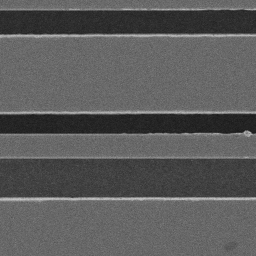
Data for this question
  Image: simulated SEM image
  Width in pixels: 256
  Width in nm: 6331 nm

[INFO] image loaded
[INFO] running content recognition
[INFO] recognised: lines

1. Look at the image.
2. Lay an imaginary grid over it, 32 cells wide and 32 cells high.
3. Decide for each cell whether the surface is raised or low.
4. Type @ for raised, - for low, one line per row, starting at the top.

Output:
@@@@@@@@@@@@@@@@@@@@@@@@@@@@@@@@
--------------------------------
--------------------------------
--------------------------------
@@@@@@@@@@@@@@@@@@@@@@@@@@@@@@@@
@@@@@@@@@@@@@@@@@@@@@@@@@@@@@@@@
@@@@@@@@@@@@@@@@@@@@@@@@@@@@@@@@
@@@@@@@@@@@@@@@@@@@@@@@@@@@@@@@@
@@@@@@@@@@@@@@@@@@@@@@@@@@@@@@@@
@@@@@@@@@@@@@@@@@@@@@@@@@@@@@@@@
@@@@@@@@@@@@@@@@@@@@@@@@@@@@@@@@
@@@@@@@@@@@@@@@@@@@@@@@@@@@@@@@@
@@@@@@@@@@@@@@@@@@@@@@@@@@@@@@@@
@@@@@@@@@@@@@@@@@@@@@@@@@@@@@@@@
--------------------------------
--------------------------------
------------------------------@-
@@@@@@@@@@@@@@@@@@@@@@@@@@@@@@@@
@@@@@@@@@@@@@@@@@@@@@@@@@@@@@@@@
@@@@@@@@@@@@@@@@@@@@@@@@@@@@@@@@
--------------------------------
--------------------------------
--------------------------------
--------------------------------
--------------------------------
@@@@@@@@@@@@@@@@@@@@@@@@@@@@@@@@
@@@@@@@@@@@@@@@@@@@@@@@@@@@@@@@@
@@@@@@@@@@@@@@@@@@@@@@@@@@@@@@@@
@@@@@@@@@@@@@@@@@@@@@@@@@@@@@@@@
@@@@@@@@@@@@@@@@@@@@@@@@@@@@@@@@
@@@@@@@@@@@@@@@@@@@@@@@@@@@@@@@@
@@@@@@@@@@@@@@@@@@@@@@@@@@@@@@@@